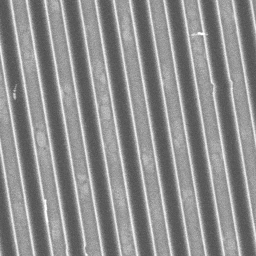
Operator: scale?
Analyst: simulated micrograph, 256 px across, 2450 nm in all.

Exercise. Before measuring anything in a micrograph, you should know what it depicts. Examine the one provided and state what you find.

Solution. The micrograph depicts parallel lines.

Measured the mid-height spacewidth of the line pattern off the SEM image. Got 142 nanometres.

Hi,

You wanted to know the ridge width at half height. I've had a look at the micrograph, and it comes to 176 nm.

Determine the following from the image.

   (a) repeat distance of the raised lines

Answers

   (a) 0.325 microns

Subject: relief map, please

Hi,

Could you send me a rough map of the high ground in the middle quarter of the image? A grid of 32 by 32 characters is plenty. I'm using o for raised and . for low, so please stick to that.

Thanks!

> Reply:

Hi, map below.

..ooooo....oooo....ooooo....oooo
..ooooo....oooo....ooooo....oooo
..ooooo....oooo....ooooo....oooo
..ooooo....ooooo...ooooo....oooo
..ooooo....ooooo....oooo....oooo
...oooo....ooooo....ooooo...oooo
...ooooo....oooo....ooooo....ooo
...ooooo....oooo....ooooo....ooo
...ooooo....oooo.....oooo....ooo
...ooooo....ooooo....oooo....ooo
...ooooo....ooooo....oooo....ooo
....oooo....ooooo....ooooo...ooo
....oooo....ooooo....ooooo....oo
....ooooo....oooo....ooooo....oo
....ooooo....oooo.....oooo....oo
....ooooo....ooooo....oooo....oo
o...ooooo....ooooo....oooo....oo
o....oooo....ooooo....ooooo...oo
o....oooo....ooooo....ooooo....o
o....ooooo....oooo....ooooo....o
o....ooooo....oooo....ooooo....o
o....ooooo....ooooo....oooo....o
oo...ooooo....ooooo....oooo....o
oo....oooo....ooooo....oooo....o
oo....oooo.....oooo....ooooo....
oo....ooooo....oooo....ooooo....
oo....ooooo....oooo....ooooo....
oo....ooooo....ooooo....oooo....
ooo...ooooo....ooooo....oooo....
ooo....oooo....ooooo....oooo....
ooo....oooo.....oooo....ooooo...
ooo....ooooo....oooo....ooooo...